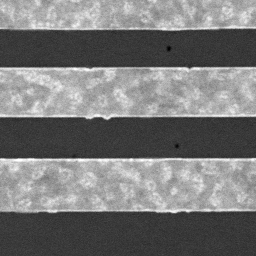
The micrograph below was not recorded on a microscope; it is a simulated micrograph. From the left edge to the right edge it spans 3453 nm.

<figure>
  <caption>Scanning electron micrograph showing one or a few lines or trenches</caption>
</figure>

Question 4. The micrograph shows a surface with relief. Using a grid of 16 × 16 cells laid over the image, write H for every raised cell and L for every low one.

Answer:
HHHHHHHHHHHHHHHH
HHHHHHHHHHHHHHHH
LLLLLLLLLLLLLLLL
LLLLLLLLLLLLLLLL
HHHHHHHHHHHHHHHH
HHHHHHHHHHHHHHHH
HHHHHHHHHHHHHHHH
LLLLLLLLLLLLLLLL
LLLLLLLLLLLLLLLL
LLLLLLLLLLLLLLLL
HHHHHHHHHHHHHHHH
HHHHHHHHHHHHHHHH
HHHHHHHHHHHHHHHH
LLLLLLLLLLLLLLLL
LLLLLLLLLLLLLLLL
LLLLLLLLLLLLLLLL